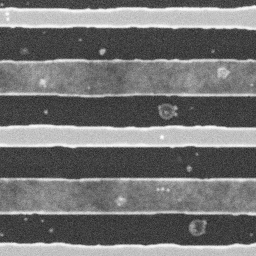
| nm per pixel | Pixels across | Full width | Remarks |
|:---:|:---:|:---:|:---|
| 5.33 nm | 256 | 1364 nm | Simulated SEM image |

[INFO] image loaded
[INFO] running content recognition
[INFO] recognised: lines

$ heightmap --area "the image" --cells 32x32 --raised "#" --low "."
................................
################################
################################
.....................#...#######
................................
................................
................................
.......####.............######..
################################
################################
################################
################################
................................
................................
................................
................................
################################
################################
................................
................................
................................
................................
################################
################################
################################
################################
################################
................................
................................
................................
###.####........................
################################